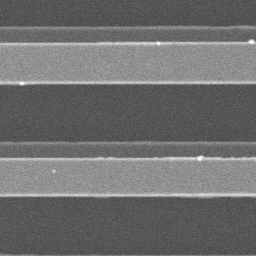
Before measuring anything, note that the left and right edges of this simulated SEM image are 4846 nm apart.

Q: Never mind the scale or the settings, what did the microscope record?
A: lines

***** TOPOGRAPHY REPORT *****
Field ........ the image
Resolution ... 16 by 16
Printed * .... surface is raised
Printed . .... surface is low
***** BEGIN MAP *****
................
................
****************
****************
****************
................
................
................
................
****************
****************
****************
................
................
................
................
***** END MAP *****